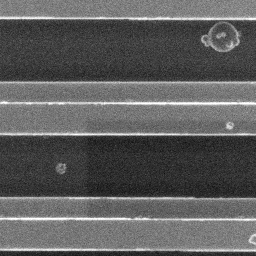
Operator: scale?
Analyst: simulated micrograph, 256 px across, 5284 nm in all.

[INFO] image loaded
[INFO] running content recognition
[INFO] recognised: lines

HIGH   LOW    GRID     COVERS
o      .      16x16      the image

oooooooooooooooo
................
................
................
................
oooooooooooooooo
oooooooooooooooo
oooooooooooooooo
................
................
................
................
oooooooooooooooo
oooooooooooooooo
oooooooooooooooo
oooooooooooooooo